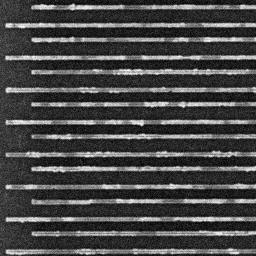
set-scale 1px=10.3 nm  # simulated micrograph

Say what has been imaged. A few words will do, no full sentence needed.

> parallel lines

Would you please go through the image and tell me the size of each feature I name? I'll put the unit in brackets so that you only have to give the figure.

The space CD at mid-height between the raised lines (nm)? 142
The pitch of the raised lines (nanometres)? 168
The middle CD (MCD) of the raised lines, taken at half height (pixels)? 3.37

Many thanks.